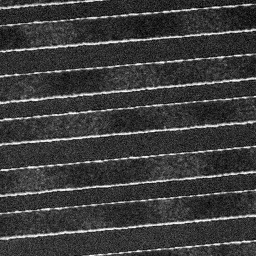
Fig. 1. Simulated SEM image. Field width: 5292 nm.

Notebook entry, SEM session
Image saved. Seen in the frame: lines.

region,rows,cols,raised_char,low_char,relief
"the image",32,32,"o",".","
ooooooo.........................
....................oooooooooooo
.........ooooooooooooooooooooooo
oooooooooooooooooooooooooooooooo
oooooooooooooooooooooooo........
ooooooooooo.....................
................................
.......................ooooooooo
............oooooooooooooooooooo
.ooooooooooooooooooooooooooooooo
oooooooooooooooooooooooooo......
ooooooooooooooo.................
oooo........................oooo
................oooooooooooooooo
.....ooooooooooooooooooooooooooo
ooooooooooooooooooooooooooooo...
ooooooooooooooooooo.............
ooooooo.........................
..............................oo
...................ooooooooooooo
........oooooooooooooooooooooooo
oooooooooooooooooooooooooooooooo
oooooooooooooooooooooo..........
ooooooooooo.....................
.........................ooooooo
............oooooooooooooooooooo
..oooooooooooooooooooooooooooooo
oooooooooooooooooooooooooo......
oooooooooooooooo................
ooooo...........................
............................oooo
.................ooooooooooooooo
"